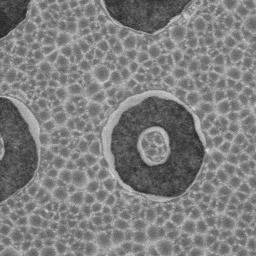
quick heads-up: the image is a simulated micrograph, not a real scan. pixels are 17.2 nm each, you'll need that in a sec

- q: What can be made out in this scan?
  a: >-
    ring-shaped grooves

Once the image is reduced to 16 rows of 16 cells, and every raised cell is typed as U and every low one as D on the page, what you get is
DDUUUUUDDDDDUUUU
DUUUUUUDDDUUUUUU
UUUUUUUUUUUUUUUU
UUUUUUUUUUUUUUUU
UUUUUUUUUUUUUUUU
UUUUUUUUUUUUUUUU
DUUUUUUUDDDUUUUU
DDUUUUUDDDDDUUUU
DDUUUUUDDUDDUUUU
DDUUUUUDDUDDDUUU
DDUUUUUDDDDDDUUU
DDUUUUUUDDDDUUUU
UUUUUUUUUUUUUUUU
UUUUUUUUUUUUUUUU
UUUUUUUUUUUUUUUU
UUUUUUUUUUUUUUUU